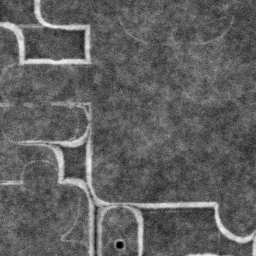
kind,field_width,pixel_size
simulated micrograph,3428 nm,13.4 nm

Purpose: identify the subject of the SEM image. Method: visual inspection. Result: wiring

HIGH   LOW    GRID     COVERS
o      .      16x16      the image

..oooooooooooooo
...ooooooooooooo
o....ooooooooooo
o....ooooooooooo
oooooooooooooooo
oooooooooooooooo
oooooooooooooooo
oooooooooooooooo
oooooooooooooooo
oooo..oooooooooo
oooo..oooooooooo
oooooooooooooooo
oooooooooooooooo
ooooooooo.....oo
ooooooooo.....oo
ooooooooo.......